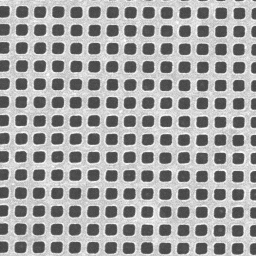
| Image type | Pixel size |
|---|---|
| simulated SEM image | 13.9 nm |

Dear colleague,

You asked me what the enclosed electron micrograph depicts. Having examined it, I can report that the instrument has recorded a regular array of holes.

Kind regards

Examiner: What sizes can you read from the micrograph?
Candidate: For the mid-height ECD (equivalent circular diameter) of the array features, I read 184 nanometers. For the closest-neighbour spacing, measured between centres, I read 250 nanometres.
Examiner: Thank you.